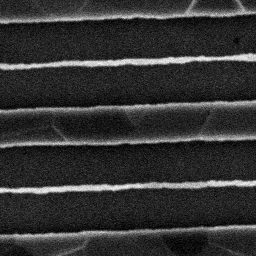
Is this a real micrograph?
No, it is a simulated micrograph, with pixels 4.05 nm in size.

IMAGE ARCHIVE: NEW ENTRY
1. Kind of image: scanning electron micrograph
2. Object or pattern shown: lines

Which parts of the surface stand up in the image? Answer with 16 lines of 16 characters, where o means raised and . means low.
oooooooooooooooo
................
................
................
................
................
..........oooooo
oooooooooooooooo
oooooooooooooooo
................
................
................
................
................
.....ooooooooooo
oooooooooooooooo